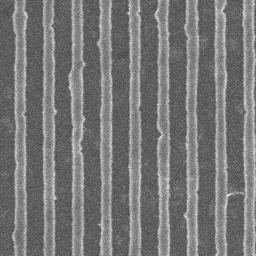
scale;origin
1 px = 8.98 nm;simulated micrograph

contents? parallel lines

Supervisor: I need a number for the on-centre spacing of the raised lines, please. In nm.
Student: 257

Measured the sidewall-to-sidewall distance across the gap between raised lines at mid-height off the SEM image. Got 166 nm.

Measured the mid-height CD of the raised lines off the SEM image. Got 0.0909 um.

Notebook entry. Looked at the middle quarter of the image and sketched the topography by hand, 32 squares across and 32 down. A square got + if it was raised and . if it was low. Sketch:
..+++....+++.....++.....++.....+
..+++....+++.....++.....++.....+
..++.....+++.....++.....++.....+
.++++.....++.....++.....++.....+
..+++....+++.....++.....++.....+
.++++.....++.....++.....++.....+
..+++.....++.....++.....++.....+
..+++.....++....+++.....++.....+
..+++....+++....+++.....++.....+
..+++....+++.....++.....++.....+
..+++....+++.....++.....++.....+
..+++....+++.....++.....++.....+
..+++....+++.....++.....++.....+
..+++....+++.....++.....++.....+
..+++....+++.....++....+++.....+
..+++....+++.....++....+++.....+
..+++....+++.....++.....++.....+
..+++....+++....+++.....++.....+
..+++....+++.....++.....++.....+
..++.....+++.....++.....++.....+
..++.....+++.....++....+++.....+
..++.....+++....+++.....++.....+
..++.....+++....+++....+++.....+
..+++....+++....+++....+++.....+
..+++....+++....+++.....++.....+
..+++....+++....+++.....++.....+
..+++....+++....+++.....++.....+
..+++....+++....+++.....++.....+
..+++....+++....+++.....++.....+
..+++.....++....+++.....++.....+
..+++.....++....+++.....++.....+
..+++.....++....+++.....++.....+